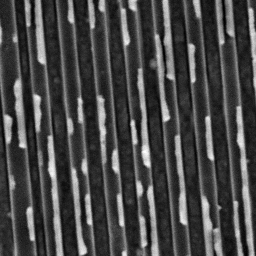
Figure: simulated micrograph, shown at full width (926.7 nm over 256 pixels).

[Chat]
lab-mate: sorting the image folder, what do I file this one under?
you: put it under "parallel lines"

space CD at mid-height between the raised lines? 0.0552 microns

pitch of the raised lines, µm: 0.114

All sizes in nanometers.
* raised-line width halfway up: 58.1